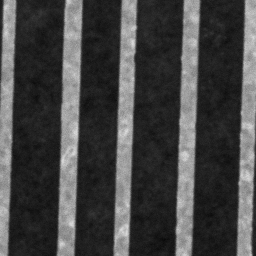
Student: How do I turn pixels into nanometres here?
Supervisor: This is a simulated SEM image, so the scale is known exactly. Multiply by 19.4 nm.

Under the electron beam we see one or a few lines or trenches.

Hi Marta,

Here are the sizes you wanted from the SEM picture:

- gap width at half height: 906 nm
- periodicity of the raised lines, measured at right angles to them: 1160 nm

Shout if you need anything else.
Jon